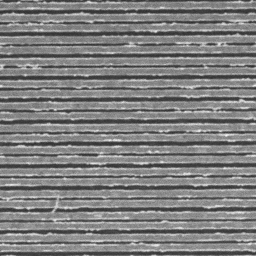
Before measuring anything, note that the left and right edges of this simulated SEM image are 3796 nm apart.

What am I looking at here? parallel lines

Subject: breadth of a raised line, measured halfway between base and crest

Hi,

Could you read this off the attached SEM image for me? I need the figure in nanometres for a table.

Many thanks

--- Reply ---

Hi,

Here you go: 106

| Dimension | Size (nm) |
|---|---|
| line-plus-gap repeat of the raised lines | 163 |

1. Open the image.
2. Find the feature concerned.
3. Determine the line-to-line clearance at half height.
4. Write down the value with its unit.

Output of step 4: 53.8 nm